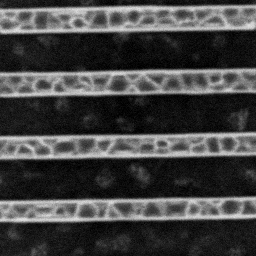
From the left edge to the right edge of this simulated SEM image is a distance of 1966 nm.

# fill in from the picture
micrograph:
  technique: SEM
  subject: one or a few lines or trenches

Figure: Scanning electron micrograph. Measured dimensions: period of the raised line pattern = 0.487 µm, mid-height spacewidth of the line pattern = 332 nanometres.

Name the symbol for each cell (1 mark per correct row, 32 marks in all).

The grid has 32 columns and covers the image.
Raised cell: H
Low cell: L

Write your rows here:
LLLLLLLLLLLLLLLLLLLLLLLLLLLLLLLL
HHHHHHHHHHHHHHHHHHHHHHHHHHHHHHHH
HHHHHHHHHHHHHHHHHHHHHHHHHHHHHHHH
HHHHHHHHHHHHHHHHHHHHHHHHHHLLHHHH
LLLLLLLLLLLLLLLLLLLLLLLLLLLLLLLL
LLLLLLLLLLLLLLLLLLLLLLLLLLLLLLLL
LLLLLLLLLLLLLLLLLLLLLLLLLLLLLLLL
LLLLLLLLLLLLLLLLLLLLLLLLLLLLLLLL
LLLLLLLLLLLLLLLLLLLLLLLLLLLLLLLL
HHHHHHHHHHHHHHHHHHHHHHHHHHHHHHHH
HHHHHHHHHHHHHHHHHHHHHHHHHHHHHHHH
HHHHHHHHHHHHHHHHHHHHHHLLLLLLLLLL
LLLLLLLLLLLLLLLLLLLLLLLLLLLLLLLL
LLLLLLLLLLLLLLLLLLLLLLLLLLLLLLLL
LLLLLLLLLLLLLLLLLLLLLLLLLLLLLLLL
LLLLLLLLLLLLLLLLLLLLLLLLLLLLLLLL
LLLLLLLLLLLLLLLLLLLLLLLLLLLLLLLL
HHHHHHHHHHHHHHHHHHHHHHHHHHHHHHHH
HHHHHHHHHHHHHHHHHHHHHHHHHHHHHHHH
HHHHHHHHHHLLLLLLLLLLLLLLLLLLLLLL
LLLLLLLLLLLLLLLLLLLLLLLLLLLLLLLL
LLLLLLLLLLLLLLLLLLLLLLLLLLLLLLLL
LLLLLLLLLLLLLLLLLLLLLLLLLLLLLLLL
LLLLLLLLLLLLLLLLLLLLLLLLLLLLLLLL
LLLLLLLLLLLLLLLLLLLLLLLLLLLLLLLL
HHHHHHHHHHHHHHHHHHHHHHHHHHHHHHHH
HHHHHHHHHHHHHHHHHHHHHHHHHHHHHHHH
LHHHHHHLLLLLLLLLLLLLLLLLLLLLLLLL
LLLLLLLLLLLLLLLLLLLLLLLLLLLLLLLL
LLLLLLLLLLLLLLLLLLLLLLLLLLLLLLLL
LLLLLLLLLLLLLLLLLLLLLLLLLLLLLLLL
LLLLLLLLLLLLLLLLLLLLLLLLLLLLLLLL